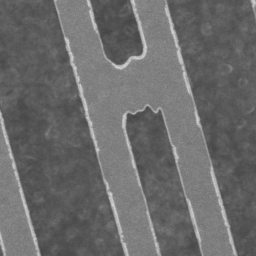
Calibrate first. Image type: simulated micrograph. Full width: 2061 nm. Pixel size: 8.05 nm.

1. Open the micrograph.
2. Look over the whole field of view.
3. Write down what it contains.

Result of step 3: one or a few lines or trenches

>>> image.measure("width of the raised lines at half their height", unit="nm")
270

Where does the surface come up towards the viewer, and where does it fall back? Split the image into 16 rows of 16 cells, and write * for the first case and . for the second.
....**..***.....
....**...**.....
....**...**.....
....***..**.....
.....*******....
.....*******....
*....*******....
.....***..**....
......**...**...
*.....**...**...
*.....***..**...
*......**..***..
**.....**...**..
**.....**...**..
**.....***..**..
**......**...**.